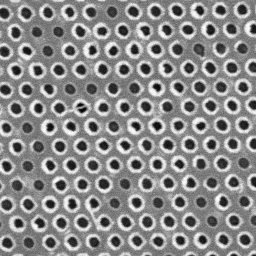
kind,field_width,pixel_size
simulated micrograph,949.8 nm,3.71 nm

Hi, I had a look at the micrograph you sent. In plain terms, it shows a regular array of holes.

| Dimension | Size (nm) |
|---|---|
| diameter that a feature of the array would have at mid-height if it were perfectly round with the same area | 38.4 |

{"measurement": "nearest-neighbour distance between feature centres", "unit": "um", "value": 0.079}